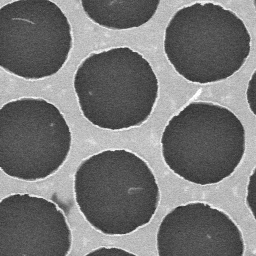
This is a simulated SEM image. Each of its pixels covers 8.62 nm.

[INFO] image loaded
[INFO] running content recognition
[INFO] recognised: holes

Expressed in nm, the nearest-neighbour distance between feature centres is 865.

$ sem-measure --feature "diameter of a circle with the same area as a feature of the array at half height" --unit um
0.711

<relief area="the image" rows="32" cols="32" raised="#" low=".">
#......###..........####.#.#####
........###........###.......###
........###........##.........##
.........#####..#####..........#
.........############..........#
.........############..........#
.........####....####..........#
........###.......###..........#
........##.........###........##
##....###..........####......###
#########...........###########.
##########..........###########.
##...#####.........############.
.......###.........####.....###.
........###........###.......###
........####......###.........##
.........###########...........#
.........###########...........#
.........###########...........#
........####.....###..........##
........##........###.........##
#......##..........###.......###
###.#####..........####.....###.
#########...........###########.
#...#####...........###########.
.......###..........####.######.
........##.........##.......####
........###........#.........###
.........###.....###..........##
.........###########..........##
.........###########..........##
.........##.....####..........##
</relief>